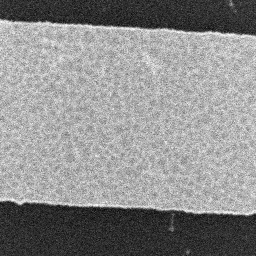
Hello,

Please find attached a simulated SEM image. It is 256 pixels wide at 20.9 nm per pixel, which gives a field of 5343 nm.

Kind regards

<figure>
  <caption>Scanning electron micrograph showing one or a few lines or trenches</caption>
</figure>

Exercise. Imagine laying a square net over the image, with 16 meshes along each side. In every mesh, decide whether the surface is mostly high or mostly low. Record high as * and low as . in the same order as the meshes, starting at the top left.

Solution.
................
***.............
****************
****************
****************
****************
****************
****************
****************
****************
****************
****************
****************
................
................
................